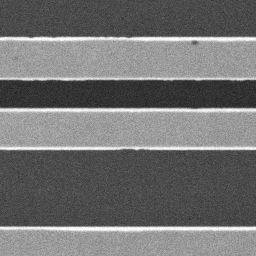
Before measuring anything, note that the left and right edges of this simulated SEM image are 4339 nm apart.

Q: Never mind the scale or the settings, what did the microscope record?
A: lines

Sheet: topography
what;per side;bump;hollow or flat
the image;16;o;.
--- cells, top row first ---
................
................
oooooooooooooooo
oooooooooooooooo
oooooooooooooooo
................
................
oooooooooooooooo
oooooooooooooooo
................
................
................
................
................
oooooooooooooooo
oooooooooooooooo